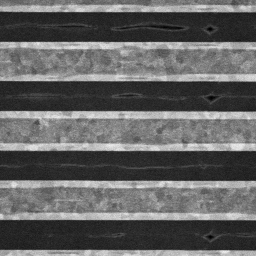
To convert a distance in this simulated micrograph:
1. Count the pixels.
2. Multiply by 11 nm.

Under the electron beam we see wiring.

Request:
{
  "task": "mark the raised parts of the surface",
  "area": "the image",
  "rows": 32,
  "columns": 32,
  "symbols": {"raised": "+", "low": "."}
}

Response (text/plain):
++++++++++++++++++++++++++++++++
................................
................................
................................
................................
................................
++++++++++++++++++++++++++++++++
++++++++++++++++++++++++++++++++
++++++++++++++++++++++++++++++++
.+++++.++++++++...++++++++++++++
................................
................................
................................
................................
++++++++++++++++++++++++++++++++
++++++++++++++++++++++++++++++++
++++++++++++++++++++++++++++++++
++++++++++++++++++++++++++++++++
................................
................................
................................
................................
................................
++++++++++++++++++++++++++++++++
++++++++++++++++++++++++++++++++
++++++++++++++++++++++++++++++++
++++++++++++++++++++++++++++++++
................................
................................
................................
................................
................................